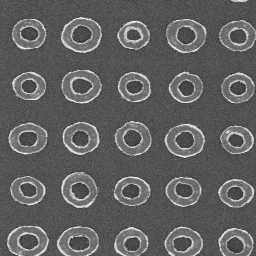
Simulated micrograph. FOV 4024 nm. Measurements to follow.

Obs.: a regular array of ring-shaped raised bodies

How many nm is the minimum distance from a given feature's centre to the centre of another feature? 806